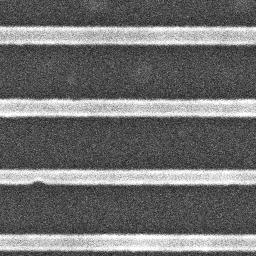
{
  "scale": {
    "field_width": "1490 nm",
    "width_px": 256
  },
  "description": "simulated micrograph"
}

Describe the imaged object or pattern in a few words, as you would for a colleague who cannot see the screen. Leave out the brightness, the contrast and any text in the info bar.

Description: one or a few lines or trenches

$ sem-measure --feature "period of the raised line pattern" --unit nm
402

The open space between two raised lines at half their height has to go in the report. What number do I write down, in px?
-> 56.5